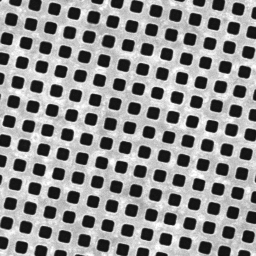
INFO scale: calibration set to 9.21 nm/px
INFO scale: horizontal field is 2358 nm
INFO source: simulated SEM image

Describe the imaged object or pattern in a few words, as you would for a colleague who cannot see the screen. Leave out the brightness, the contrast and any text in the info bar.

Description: a regular array of holes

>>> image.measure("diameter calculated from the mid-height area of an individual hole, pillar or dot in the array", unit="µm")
0.121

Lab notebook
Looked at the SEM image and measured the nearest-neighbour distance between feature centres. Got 19.7 pixels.